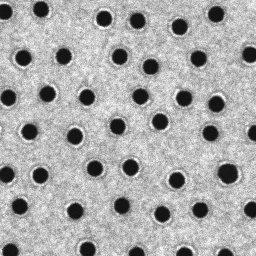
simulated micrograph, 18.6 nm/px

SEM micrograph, a regular array of holes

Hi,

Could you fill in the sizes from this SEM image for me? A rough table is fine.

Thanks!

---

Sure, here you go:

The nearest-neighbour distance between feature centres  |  690 nm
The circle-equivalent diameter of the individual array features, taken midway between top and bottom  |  313 nm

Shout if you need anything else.